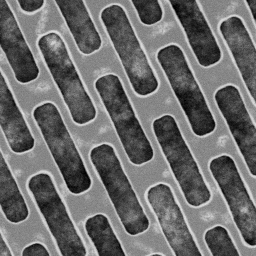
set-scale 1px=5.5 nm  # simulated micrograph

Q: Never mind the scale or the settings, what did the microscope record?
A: holes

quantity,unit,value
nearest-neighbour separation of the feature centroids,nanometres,375